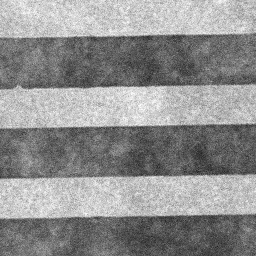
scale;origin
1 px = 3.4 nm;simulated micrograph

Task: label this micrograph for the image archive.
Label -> one or a few lines or trenches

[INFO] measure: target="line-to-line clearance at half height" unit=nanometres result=178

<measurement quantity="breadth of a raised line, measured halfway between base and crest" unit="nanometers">130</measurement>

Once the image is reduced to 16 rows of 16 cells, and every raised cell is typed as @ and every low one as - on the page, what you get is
@@@@@@@@@@@@@@@@
@@@@@@@@@@@@@@@@
----------------
----------------
----------------
------@@@@@@@@@@
@@@@@@@@@@@@@@@@
@@@@@@@@@@@@@@@@
----------------
----------------
----------------
@@@@@@@@@@@@@@@@
@@@@@@@@@@@@@@@@
@@@@@@----------
----------------
----------------